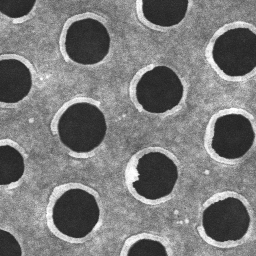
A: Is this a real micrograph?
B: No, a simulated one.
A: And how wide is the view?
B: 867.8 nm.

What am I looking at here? holes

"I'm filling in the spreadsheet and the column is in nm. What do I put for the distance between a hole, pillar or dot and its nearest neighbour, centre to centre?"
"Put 291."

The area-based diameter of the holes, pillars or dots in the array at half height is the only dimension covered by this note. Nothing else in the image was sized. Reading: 156 nanometers